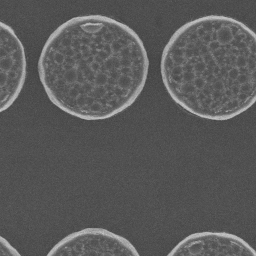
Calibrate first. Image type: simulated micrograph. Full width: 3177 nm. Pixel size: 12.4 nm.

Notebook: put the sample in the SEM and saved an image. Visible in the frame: raised bodies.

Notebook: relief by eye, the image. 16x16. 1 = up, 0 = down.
0000000000000000
0000111000001110
1001111110011111
1001111110111111
1001111110111111
1001111110011111
0000111100011111
0000000000000000
0000000000000000
0000000000000000
0000000000000000
0000000000000000
0000000000000000
0000000000000000
0000000000000000
1000111100011111